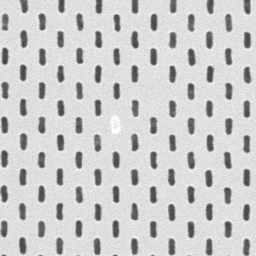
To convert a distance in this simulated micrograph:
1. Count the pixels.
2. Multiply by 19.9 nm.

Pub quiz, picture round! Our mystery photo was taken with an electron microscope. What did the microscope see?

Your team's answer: a regular array of holes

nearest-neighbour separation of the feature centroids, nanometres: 497